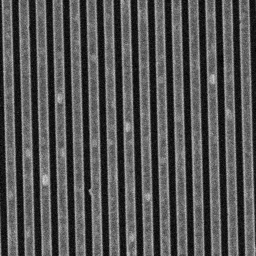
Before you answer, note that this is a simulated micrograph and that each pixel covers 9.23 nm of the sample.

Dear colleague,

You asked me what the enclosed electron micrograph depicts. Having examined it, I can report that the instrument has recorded parallel lines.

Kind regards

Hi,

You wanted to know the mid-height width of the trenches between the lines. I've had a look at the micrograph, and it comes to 0.0703 microns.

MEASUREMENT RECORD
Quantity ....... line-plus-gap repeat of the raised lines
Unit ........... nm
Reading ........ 156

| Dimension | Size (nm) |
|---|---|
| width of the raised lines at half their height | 85.3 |